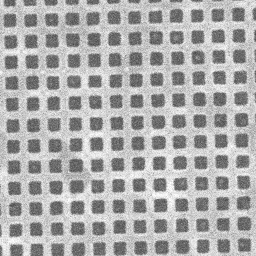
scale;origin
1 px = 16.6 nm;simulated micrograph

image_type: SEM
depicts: a regular array of holes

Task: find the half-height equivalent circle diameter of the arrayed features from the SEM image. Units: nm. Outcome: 260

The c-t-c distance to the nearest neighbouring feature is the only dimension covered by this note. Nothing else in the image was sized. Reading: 341 nanometers